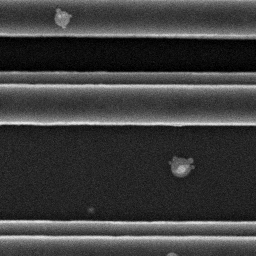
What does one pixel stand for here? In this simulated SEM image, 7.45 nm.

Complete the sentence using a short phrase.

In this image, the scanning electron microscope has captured lines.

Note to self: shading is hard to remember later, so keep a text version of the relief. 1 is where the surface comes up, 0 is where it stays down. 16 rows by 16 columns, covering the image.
1111111111111111
1111111111111111
0000000000000000
0000000000000000
0000000000000000
1111111111111111
1111111111111111
1111111111111111
0000000000000000
0000000000000000
0000000000000000
0000000000000000
0000000000000000
0000000000000000
1111111111111111
1111111111111111